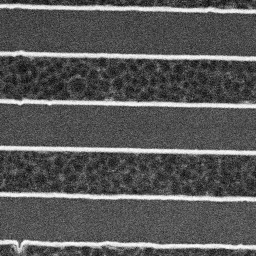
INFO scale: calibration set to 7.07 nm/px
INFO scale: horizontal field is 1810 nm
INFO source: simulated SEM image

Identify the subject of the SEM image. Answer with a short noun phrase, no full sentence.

one or a few lines or trenches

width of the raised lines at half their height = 336 nm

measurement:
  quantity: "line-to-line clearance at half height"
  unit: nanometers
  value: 330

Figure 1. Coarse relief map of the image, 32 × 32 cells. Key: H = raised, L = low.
HHHHHHHHHHHHHHHHHHHHHHHHHHHHHHHH
LLLLLLLLLLLLLLLLLLLLLLLLLLLLLLLL
LLLLLLLLLLLLLLLLLLLLLLLLLLLLLLLL
LLLLLLLLLLLLLLLLLLLLLLLLLLLLLLLL
LLLLLLLLLLLLLLLLLLLLLLLLLLLLLLLL
LLLLLLLLLLLLLLLLLLLLLLLLLLLLLLLL
LLLLLLLLLLLLLLLLLLLLLLLLLLLLLLLL
HHHHHHHHHHHHHHHHHHHHHHHHHHHHHHHH
HHHHHHHHHHHHHHHHHHHHHHHHHHHHHHHH
HHHHHHHHHHHHHHHHHHHHHHHHHHHHHHHH
HHHHHHHHHHHHHHHHHHHHHHHHHHHHHHHH
HHHHHHHHHHHHHHHHHHHHHHHHHHHHHHHH
HHHHHHHHHHHHHHHHHHHHHHHHHHHHHHHH
LLLLLLLLLLLLLLLLLLLLLLLLLLLLLLLL
LLLLLLLLLLLLLLLLLLLLLLLLLLLLLLLL
LLLLLLLLLLLLLLLLLLLLLLLLLLLLLLLL
LLLLLLLLLLLLLLLLLLLLLLLLLLLLLLLL
LLLLLLLLLLLLLLLLLLLLLLLLLLLLLLLL
HLLLLLLLLLLLLLLLLLLLLLLLLLLLLLLL
HHHHHHHHHHHHHHHHHHHHHHHHHHHHHHHH
HHHHHHHHHHHHHHHHHHHHHHHHHHHHHHHH
HHHHHHHHHHHHHHHHHHHHHHHHHHHHHHHH
HHHHHHHHHHHHHHHHHHHHHHHHHHHHHHHH
HHHHHHHHHHHHHHHHHHHHHHHHHHHHHHHH
LLLLLLLLLLHHHHHHHHHHHHHHHHHHHHHH
LLLLLLLLLLLLLLLLLLLLLLLLLLLLLLLL
LLLLLLLLLLLLLLLLLLLLLLLLLLLLLLLL
LLLLLLLLLLLLLLLLLLLLLLLLLLLLLLLL
LLLLLLLLLLLLLLLLLLLLLLLLLLLLLLLL
LLLLLLLLLLLLLLLLLLLLLLLLLLLLLLLL
HHLHHLLHLLLLHHLLLLLLLLLLLLLLLLLL
HHHHHHHHHHHHHHHHHHHHHHHHHHHHHHHH